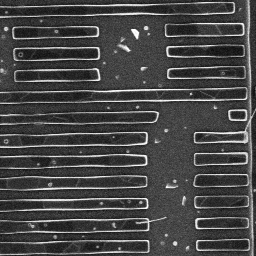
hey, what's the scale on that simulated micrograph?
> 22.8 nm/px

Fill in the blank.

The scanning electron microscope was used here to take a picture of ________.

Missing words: wiring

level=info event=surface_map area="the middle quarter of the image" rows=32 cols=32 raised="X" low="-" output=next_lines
--------------------------------
---XXXXX------------------XXXXXX
XXXXXXXXX-----------------XXXXXX
XXXXXXXXX-----------------------
--------------------------------
--------------------------------
-----------------------------XXX
XXXXXXXXXXXXXXXXXXXXXXXXXXXXXXXX
XXXXXXXXXXXXXXXXXXXXXXXXXXXXXXXX
--------------------------------
--------------------------------
--------------------------------
XXXXXXXXXXXXXXXXXXXXXXX---------
XXXXXXXXXXXXXXXXXXXXXXX---------
XXXXXXXXXXXXXXXXXXXXXX----------
--------------------------------
--------------------------------
-XXXXXXXXXXXXXXXXXXXX-----------
XXXXXXXXXXXXXXXXXXXXX-----------
XXXXXXXXXXXXXXXXXXXXX-----------
--------------------------------
--------------------------------
--------------------------------
XXXXXXXXXXXXXXXXXXXXX-----------
XXXXXXXXXXXXXXXXXXXXX-----------
XXX--------XXXX-----------------
--------------------------------
--------------------------------
XXXXXXXXXXXXXXXXXXXXX-----------
XXXXXXXXXXXXXXXXXXXXX-----------
XXXXXXXXXXXXXXXXXXXX------------
--------------------------------